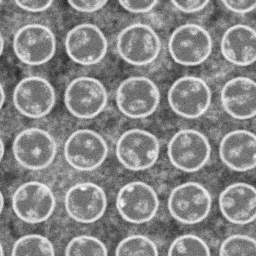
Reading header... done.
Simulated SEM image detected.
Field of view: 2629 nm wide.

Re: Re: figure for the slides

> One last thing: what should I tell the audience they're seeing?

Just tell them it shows a regular array of raised bodies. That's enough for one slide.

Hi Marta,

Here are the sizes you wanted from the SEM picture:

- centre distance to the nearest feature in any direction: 529 nanometers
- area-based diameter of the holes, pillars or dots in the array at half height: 403 nanometres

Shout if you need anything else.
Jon